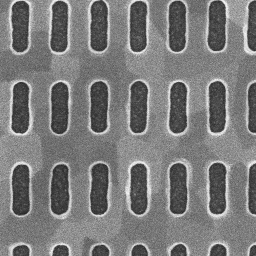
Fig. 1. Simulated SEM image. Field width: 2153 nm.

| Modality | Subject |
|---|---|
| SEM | a regular array of holes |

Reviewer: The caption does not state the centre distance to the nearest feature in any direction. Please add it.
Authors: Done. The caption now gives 0.33 µm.